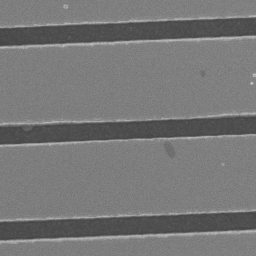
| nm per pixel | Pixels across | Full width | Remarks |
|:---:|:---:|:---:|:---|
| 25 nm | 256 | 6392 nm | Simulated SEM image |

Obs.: lines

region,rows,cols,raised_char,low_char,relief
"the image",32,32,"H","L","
HHHHHHHHHHHHHHHHHHHHHHHHHHHHHHHH
HHHHHHHHHHHHHHHHHHHHHHHHHHHHHHHH
HHHHHHHHHHHHHHHHHHHHHHHLLLLLLLLL
LLLLLLLLLLLLLLLLLLLLLLLLLLLLLLLL
LLLLLLLLLLLLLLLLLLLLLLLLLLLLLLHH
LLLLLLLLHHHHHHHHHHHHHHHHHHHHHHHH
HHHHHHHHHHHHHHHHHHHHHHHHHHHHHHHH
HHHHHHHHHHHHHHHHHHHHHHHHHHHHHHHH
HHHHHHHHHHHHHHHHHHHHHHHHHHHHHHHH
HHHHHHHHHHHHHHHHHHHHHHHHHHHHHHHH
HHHHHHHHHHHHHHHHHHHHHHHHHHHHHHHH
HHHHHHHHHHHHHHHHHHHHHHHHHHHHHHHH
HHHHHHHHHHHHHHHHHHHHHHHHHHHHHHHH
HHHHHHHHHHHHHHHHHHHHHHHHHHHHHHHH
HHHHHHHHHHHHHHHHHHHHHHHHHHHHHLLL
HHHHHLLLLLLLLLLLLLLLLLLLLLLLLLLL
LLLLLLLLLLLLLLLLLLLLLLLLLLLLLLLL
LLLLLLLLLLLLLLLLHHHHHHHHHHHHHHHH
HHHHHHHHHHHHHHHHHHHHHHHHHHHHHHHH
HHHHHHHHHHHHHHHHHHHHHHHHHHHHHHHH
HHHHHHHHHHHHHHHHHHHHHHHHHHHHHHHH
HHHHHHHHHHHHHHHHHHHHHHHHHHHHHHHH
HHHHHHHHHHHHHHHHHHHHHHHHHHHHHHHH
HHHHHHHHHHHHHHHHHHHHHHHHHHHHHHHH
HHHHHHHHHHHHHHHHHHHHHHHHHHHHHHHH
HHHHHHHHHHHHHHHHHHHHHHHHHHHHHHHH
HHHHHHHHHHHHHHHHHHHHHHHHHHHHHHLL
HHHHHLLLLLLLLLLLLLLLLLLLLLLLLLLL
LLLLLLLLLLLLLLLLLLLLLLLLLLLLLLLL
LLLLLLLLLLLLLLLLHHHHHHHHHHHHHHHH
HHHHHHHHHHHHHHHHHHHHHHHHHHHHHHHH
HHHHHHHHHHHHHHHHHHHHHHHHHHHHHHHH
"